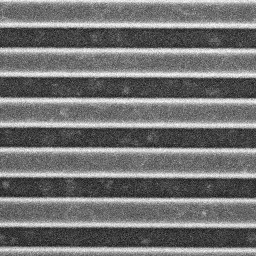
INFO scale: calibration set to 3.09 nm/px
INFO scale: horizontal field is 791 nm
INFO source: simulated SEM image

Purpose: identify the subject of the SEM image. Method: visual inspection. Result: parallel lines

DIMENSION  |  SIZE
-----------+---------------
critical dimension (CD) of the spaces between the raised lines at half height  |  23.6 pixels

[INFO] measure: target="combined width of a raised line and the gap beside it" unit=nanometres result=154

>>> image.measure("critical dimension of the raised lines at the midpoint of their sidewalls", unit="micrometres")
0.0822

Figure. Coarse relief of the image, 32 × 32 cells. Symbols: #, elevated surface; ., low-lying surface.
################################
################################
################################
................................
................................
................................
################################
################################
################################
................................
................................
................................
######..........................
################################
################################
################################
................................
................................
................................
################################
################################
################################
................................
................................
................................
################################
################################
################################
................................
................................
................................
################################